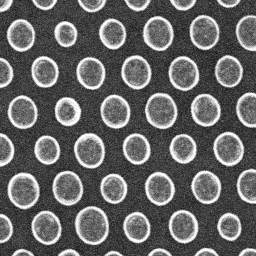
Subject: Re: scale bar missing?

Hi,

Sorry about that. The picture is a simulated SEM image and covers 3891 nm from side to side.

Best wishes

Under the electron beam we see a regular array of raised bodies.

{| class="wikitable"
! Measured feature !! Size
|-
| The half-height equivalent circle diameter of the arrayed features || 0.438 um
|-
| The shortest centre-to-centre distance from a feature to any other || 0.66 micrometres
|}